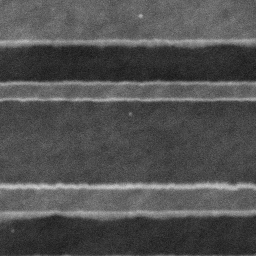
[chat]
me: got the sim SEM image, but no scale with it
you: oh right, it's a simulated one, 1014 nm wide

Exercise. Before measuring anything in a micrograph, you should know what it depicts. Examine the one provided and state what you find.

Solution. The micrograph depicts lines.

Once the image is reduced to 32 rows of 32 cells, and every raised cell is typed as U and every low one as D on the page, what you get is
UUUUUUUUUUUUUUUUUUUUUUUUUUUUUUUU
UUUUUUUUUUUUUUUUUUUUUUUUUUUUUUUU
UUUUUUUUUUUUUUUUUUUUUUUUUUUUUUUU
UUUUUUUUUUUUUUUUUUUUUUUUUUUUUUUU
UUUUUUUUUUUUUUUUUUUUUUUUUUUUUUUU
DDDDDDDDDDDDDDDDDDDDDDDDDDDDDDDD
DDDDDDDDDDDDDDDDDDDDDDDDDDDDDDDD
DDDDDDDDDDDDDDDDDDDDDDDDDDDDDDDD
DDDDDDDDDDDDDDDDDDDDDDDDDDDDDDDD
DDDDDDDDDDDDDDDDDDDDDDDDDDDDDDDD
UUUUUUUUUUUUUUUUUUUUUUUUUUUUUUUU
UUUUUUUUUUUUUUUUUUUUUUUUUUUUUUUU
DDDDDDDDDDDDDDDDDDDDDDDDDDDDDDDD
DDDDDDDDDDDDDDDDDDDDDDDDDDDDDDDD
DDDDDDDDDDDDDDDDDDDDDDDDDDDDDDDD
DDDDDDDDDDDDDDDDDDDDDDDDDDDDDDDD
DDDDDDDDDDDDDDDDDDDDDDDDDDDDDDDD
DDDDDDDDDDDDDDDDDDDDDDDDDDDDDDDD
DDDDDDDDDDDDDDDDDDDDDDDDDDDDDDDD
DDDDDDDDDDDDDDDDDDDDDDDDDDDDDDDD
DDDDDDDDDDDDDDDDDDDDDDDDDDDDDDDD
DDDDDDDDDDDDDDDDDDDDDDDDDDDDDDDD
DDDDDDDDDDDDDDDDDDDDDDDDDDDDDDDD
UUUUUUUUUUUDUUUUUUUUUUDUUUUUUDUU
UUUUUUUUUUUUUUUUUUUUUUUUUUUUUUUU
UUUUUUUUUUUUUUUUUUUUUUUUUUUUUUUU
UUUUUUUUUUUUUUUUUUUUUUUUUUUUUUUU
DDDDDDDDDDDDDDDDDDDDDDDDDDDDDDDD
DDDDDDDDDDDDDDDDDDDDDDDDDDDDDDDD
DDDDDDDDDDDDDDDDDDDDDDDDDDDDDDDD
DDDDDDDDDDDDDDDDDDDDDDDDDDDDDDDD
DDDDDDDDDDDDDDDDDDDDDDDDDDDDDDDD